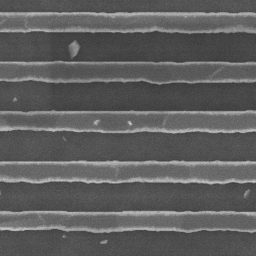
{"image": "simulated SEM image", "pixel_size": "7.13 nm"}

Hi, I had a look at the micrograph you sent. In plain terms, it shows lines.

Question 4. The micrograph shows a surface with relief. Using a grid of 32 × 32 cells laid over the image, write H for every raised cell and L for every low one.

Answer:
LLLLLLLLLLLLLLLLLLLLLLLLLLLLLLLL
LLLLLLLLLLLLLLLLLLLLLLLLLLLLLLLL
HHHHHHHHHHHHHHHHHHHHHHHHHHHHHHHH
HHHHHHHHHHHHHHHHHHHHHHHHHHHHHHHH
LLLLLLLLLLLLLLLLLLLLLLLLLLLLLLLL
LLLLLLLLLLLLLLLLLLLLLLLLLLLLLLLL
LLLLLLLLLLLLLLLLLLLLLLLLLLLLLLLL
LLLLLLLLLLLLLLLLLLLLLLLLLLLLLLLL
HHHHHHHHHHHHHHHHHHHHHHHHHHHHHHHH
HHHHHHHHHHHHHHHHHHHHHHHHHHHHHHHH
LLLLLLLLLLLLLLLLLLLHHLLLLLLLLLLL
LLLLLLLLLLLLLLLLLLLLLLLLLLLLLLLL
LLLLLLLLLLLLLLLLLLLLLLLLLLLLLLLL
LLLLLLLLLLLLLLLLLLLLLLLLLLLLLLLL
HHHHHHHHHHHHHHHHHHHHHHHHHHHHHHHH
HHHHHHHHHHHHHHHHHHHHHHHHHHHHHHHH
LLLLLLLLLLLLHHHHHLLLHHHLLLHHHHHL
LLLLLLLLLLLLLLLLLLLLLLLLLLLLLLLL
LLLLLLLLLLLLLLLLLLLLLLLLLLLLLLLL
LLLLLLLLLLLLLLLLLLLLLLLLLLLLLLLL
HHHHHHHHHHHHHHHHHHHHHHHHHHHHHHHH
HHHHHHHHHHHHHHHHHHHHHHHHHHHHHHHH
HHHHHHHHHHHHHHHHHHHHHHHHHHHHHHHH
LLLLLLLLLLLLLLLLLLLLLLLLLLLLLLLL
LLLLLLLLLLLLLLLLLLLLLLLLLLLLLLLL
LLLLLLLLLLLLLLLLLLLLLLLLLLLLLLLL
HLLHHHHHHLLLLLLHHHHHHLLHLHHHHHLL
HHHHHHHHHHHHHHHHHHHHHHHHHHHHHHHH
HHHHHHHHHHHHHHHHHHHHHHHHHHHHHHHH
LLLLLLLLLLLLLLLLLLLLLLLLLLLLLLLL
LLLLLLLLLLLLLLLLLLLLLLLLLLLLLLLL
LLLLLLLLLLLLLLLLLLLLLLLLLLLLLLLL